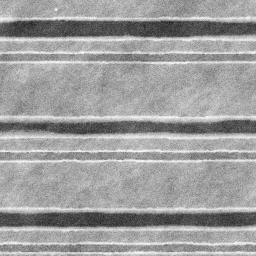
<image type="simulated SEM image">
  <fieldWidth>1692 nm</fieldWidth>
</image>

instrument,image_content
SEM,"lines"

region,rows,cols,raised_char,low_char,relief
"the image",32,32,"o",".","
oooooooooooooooooooooooooooooooo
oooooooooooooooooooooooooooooooo
................................
................................
................................
oooooooooooooooooooooooooooooooo
oooooooooooooooooooooooooooooooo
oooooooooooooooooooooooooooooooo
oooooooooooooooooooooooooooooooo
oooooooooooooooooooooooooooooooo
oooooooooooooooooooooooooooooooo
oooooooooooooooooooooooooooooooo
oooooooooooooooooooooooooooooooo
oooooooooooooooooooooooooooooooo
oooooooooooooooooooooooooooooooo
................................
................................
oooooooooooooooooooooooooooooooo
oooooooooooooooooooooooooooooooo
oooooooooooooooooooooooooooooooo
oooooooooooooooooooooooooooooooo
oooooooooooooooooooooooooooooooo
oooooooooooooooooooooooooooooooo
oooooooooooooooooooooooooooooooo
oooooooooooooooooooooooooooooooo
oooooooooooooooooooooooooooooooo
................................
................................
................................
oooooooooooooooooooooooooooooooo
oooooooooooooooooooooooooooooooo
oooooooooooooooooooooooooooooooo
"